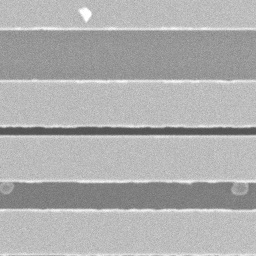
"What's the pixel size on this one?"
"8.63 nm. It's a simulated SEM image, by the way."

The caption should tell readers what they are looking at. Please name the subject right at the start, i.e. lines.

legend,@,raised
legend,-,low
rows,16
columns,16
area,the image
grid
@@@@@@@@@@@@@@@@
@@@@@@@@@@@@@@@@
----------------
----------------
----------------
@@@@@@@@@@@@@@@@
@@@@@@@@@@@@@@@@
@@@@@@@@@@@@@@@@
@@@@@@@@@@@@@@@@
@@@@@@@@@@@@@@@@
@@@@@@@@@@@@@@@@
----------------
----------------
@@@@@@@@@@@@@@@@
@@@@@@@@@@@@@@@@
@@@@@@@@@@@@@@@@